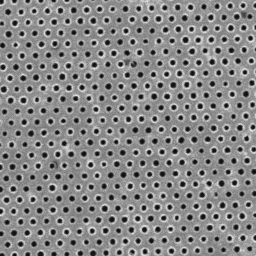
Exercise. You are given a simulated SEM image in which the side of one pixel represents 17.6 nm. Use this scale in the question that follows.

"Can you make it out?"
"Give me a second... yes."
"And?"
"a regular array of holes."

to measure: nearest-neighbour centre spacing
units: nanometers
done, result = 220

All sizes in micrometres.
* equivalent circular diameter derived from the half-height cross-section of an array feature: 0.102